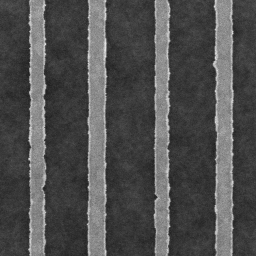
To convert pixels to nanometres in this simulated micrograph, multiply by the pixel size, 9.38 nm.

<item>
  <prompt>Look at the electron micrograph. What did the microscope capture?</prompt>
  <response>one or a few lines or trenches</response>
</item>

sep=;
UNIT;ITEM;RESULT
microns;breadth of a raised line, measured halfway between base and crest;0.141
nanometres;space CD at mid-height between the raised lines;450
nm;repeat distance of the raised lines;586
